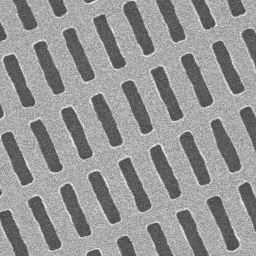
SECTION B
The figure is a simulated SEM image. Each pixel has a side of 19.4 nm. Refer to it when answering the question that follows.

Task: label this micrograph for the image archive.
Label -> a regular array of holes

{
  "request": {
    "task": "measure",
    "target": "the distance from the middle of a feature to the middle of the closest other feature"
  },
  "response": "637 nm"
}